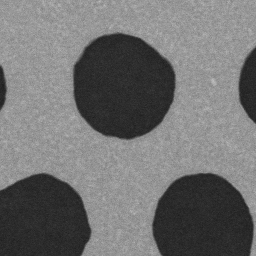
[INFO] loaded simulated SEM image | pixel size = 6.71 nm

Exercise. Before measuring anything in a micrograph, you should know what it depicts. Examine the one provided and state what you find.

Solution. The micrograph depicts holes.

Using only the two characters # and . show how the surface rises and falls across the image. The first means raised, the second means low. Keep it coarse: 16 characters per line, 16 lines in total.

################
################
######...#######
#####.....#####.
#####......####.
#####......####.
#####......####.
#####.....######
#######..#######
################
################
#...#######...##
.....#####.....#
.....#####......
......####......
.....#####......